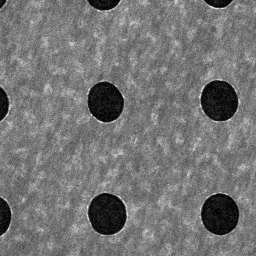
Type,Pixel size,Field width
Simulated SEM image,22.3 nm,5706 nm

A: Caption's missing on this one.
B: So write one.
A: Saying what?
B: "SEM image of holes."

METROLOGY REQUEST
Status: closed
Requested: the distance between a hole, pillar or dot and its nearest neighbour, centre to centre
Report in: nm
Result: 2500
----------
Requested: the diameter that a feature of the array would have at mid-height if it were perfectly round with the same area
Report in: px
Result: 39.9